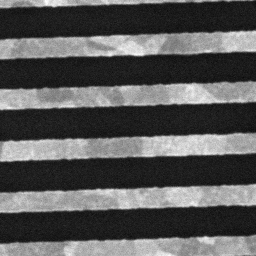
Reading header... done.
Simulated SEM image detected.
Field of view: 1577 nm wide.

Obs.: lines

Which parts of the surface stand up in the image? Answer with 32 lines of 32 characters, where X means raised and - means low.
XXXXXXXXXXXXX-------------------
--------------------------------
--------------------------------
--------------------------------
-----------------XXXXXXXXXXXXXXX
XXXXXXXXXXXXXXXXXXXXXXXXXXXXXXXX
XXXXXXXXXXXXXXXXXXXXXXXXX-------
--------------------------------
--------------------------------
--------------------------------
------------------------X-XXXXXX
XXXXXXXXXXXXXXXXXXXXXXXXXXXXXXXX
XXXXXXXXXXXXXXXXXXXXXXXXXXXXXXXX
XXX-----------------------------
--------------------------------
--------------------------------
--------------------------------
--------XXXXXXXXXXXXXXXXXXXXXXXX
XXXXXXXXXXXXXXXXXXXXXXXXXXXXXXXX
XXXXXXXXXXXXXXXXXXXX------------
--------------------------------
--------------------------------
--------------------------------
-------------------XXXXXXXXXXXXX
XXXXXXXXXXXXXXXXXXXXXXXXXXXXXXXX
XXXXXXXXXXXXXXXXXXXXXXXXXXXXXXXX
--------------------------------
--------------------------------
--------------------------------
--------------------------------
-XXXXXXXXXXXXXXXXXXXXXXXXXXXXXXX
XXXXXXXXXXXXXXXXXXXXXXXXXXXXXXXX